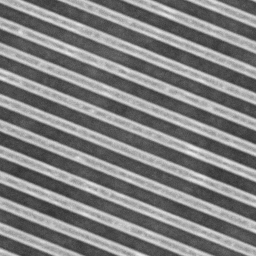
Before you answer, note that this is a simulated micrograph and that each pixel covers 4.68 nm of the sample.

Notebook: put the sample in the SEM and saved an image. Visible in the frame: parallel lines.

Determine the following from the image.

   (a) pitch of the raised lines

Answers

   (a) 112 nm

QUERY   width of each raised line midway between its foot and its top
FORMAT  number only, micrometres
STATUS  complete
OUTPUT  0.0461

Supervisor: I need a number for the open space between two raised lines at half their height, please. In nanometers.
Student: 62.4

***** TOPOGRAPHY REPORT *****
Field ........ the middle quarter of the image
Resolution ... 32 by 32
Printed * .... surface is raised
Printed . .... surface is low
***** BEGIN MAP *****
........*******.........******..
*..........******.........******
***..........*******.........***
******.........*******.........*
..******..........*******.......
....*******.........*******.....
.......******..........*******..
.........*******.........*******
**..........******..........****
*****.........*******.........**
.******.........*******.........
...*******..........******......
......******..........******....
........*******..........******.
*..........******..........*****
****.........*******..........**
******..........******..........
..*******.........*******.......
.....******..........******.....
.......*******.........*******..
..........******..........******
**..........*******.........****
******.........******..........*
.******..........*******........
....******..........******......
......*******.........*******...
.........******..........******.
*..........*******.........*****
****..........******..........**
*******.........*******.........
..*******..........******.......
.....*******.........*******....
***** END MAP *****